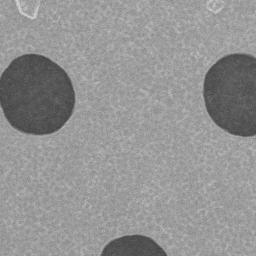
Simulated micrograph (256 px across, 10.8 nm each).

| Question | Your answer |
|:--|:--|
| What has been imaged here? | holes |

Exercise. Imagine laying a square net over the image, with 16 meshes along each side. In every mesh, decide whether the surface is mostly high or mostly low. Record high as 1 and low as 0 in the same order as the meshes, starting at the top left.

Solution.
1111111111111111
1111111111111111
1111111111111111
1001111111111100
0000111111111000
0000011111111000
0000011111111000
0000111111111000
1111111111111110
1111111111111111
1111111111111111
1111111111111111
1111111111111111
1111111111111111
1111111111111111
1111111000111111